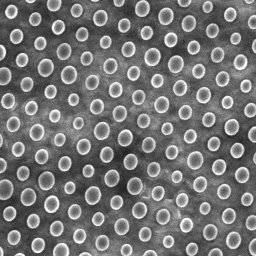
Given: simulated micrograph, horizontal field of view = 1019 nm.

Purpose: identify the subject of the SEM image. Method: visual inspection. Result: a regular array of raised bodies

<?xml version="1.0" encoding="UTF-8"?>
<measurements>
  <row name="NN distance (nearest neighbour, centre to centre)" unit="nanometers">96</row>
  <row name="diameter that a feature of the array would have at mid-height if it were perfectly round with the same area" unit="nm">54.2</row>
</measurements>